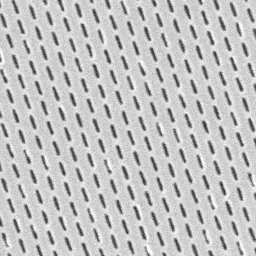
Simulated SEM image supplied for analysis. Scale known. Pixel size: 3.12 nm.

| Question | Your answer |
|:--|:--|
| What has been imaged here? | a regular array of holes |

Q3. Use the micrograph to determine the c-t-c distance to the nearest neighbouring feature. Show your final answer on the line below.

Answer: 55.9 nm